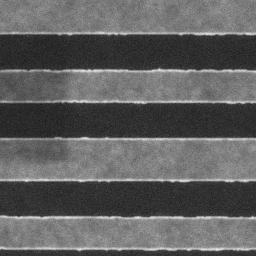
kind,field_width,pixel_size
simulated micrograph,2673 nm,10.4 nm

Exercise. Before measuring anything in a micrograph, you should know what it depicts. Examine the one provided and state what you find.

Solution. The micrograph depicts lines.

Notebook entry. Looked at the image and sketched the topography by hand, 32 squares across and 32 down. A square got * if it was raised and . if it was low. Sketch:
********************************
********************************
********************************
********************************
................................
................................
................................
................................
................................
********************************
********************************
********************************
********************************
................................
................................
................................
................................
********************************
********************************
********************************
********************************
********************************
********************************
................................
................................
................................
................................
********************************
********************************
********************************
********************************
................................